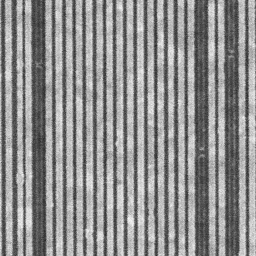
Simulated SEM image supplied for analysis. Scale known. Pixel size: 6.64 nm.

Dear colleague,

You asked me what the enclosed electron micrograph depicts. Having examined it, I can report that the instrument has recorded parallel lines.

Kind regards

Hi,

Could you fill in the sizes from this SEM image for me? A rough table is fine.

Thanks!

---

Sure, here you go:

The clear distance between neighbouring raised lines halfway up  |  32.4 nm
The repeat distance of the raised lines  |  67.3 nm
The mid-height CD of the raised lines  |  39 nm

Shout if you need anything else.